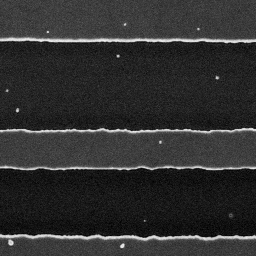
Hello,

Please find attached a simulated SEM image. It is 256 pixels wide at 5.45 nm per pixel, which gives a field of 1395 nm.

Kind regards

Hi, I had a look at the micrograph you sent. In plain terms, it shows lines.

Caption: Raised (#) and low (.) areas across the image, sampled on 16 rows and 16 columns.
################
################
################
................
................
................
................
................
################
################
##########.#####
................
................
................
................
################